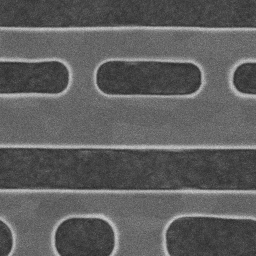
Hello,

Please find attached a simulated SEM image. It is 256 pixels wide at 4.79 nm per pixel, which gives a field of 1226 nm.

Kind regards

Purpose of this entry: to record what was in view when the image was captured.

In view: one or a few lines or trenches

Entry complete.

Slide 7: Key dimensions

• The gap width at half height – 205 nm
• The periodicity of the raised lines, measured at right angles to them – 376 nm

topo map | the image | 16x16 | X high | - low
----------------
----------------
XXXXXXXXXXXXXXXX
XXXXXXXXXXXXXXXX
----XX-------XX-
----XX------XXX-
XXXXXXXXXXXXXXXX
XXXXXXXXXXXXXXXX
XXXXXXXXXXXXXXXX
----------------
----------------
----------------
XXXXXXXXXXXXXXXX
XXXXXXXXXXXX-XXX
-XX----XXX------
-XX----XXX------